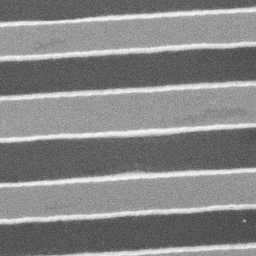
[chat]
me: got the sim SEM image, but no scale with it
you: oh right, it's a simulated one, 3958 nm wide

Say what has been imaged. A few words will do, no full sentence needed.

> lines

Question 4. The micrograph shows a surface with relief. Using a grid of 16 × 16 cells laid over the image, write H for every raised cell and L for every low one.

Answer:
LLLLLLLLLLLLLLLL
LLHHHHHHHHHHHHHH
HHHHHHHHHHHHHHHH
HHHLLLLLLLLLLLLL
LLLLLLLLLLLLLLLL
LLLLLLLLLLLLHHHH
HHHHHHHHHHHHHHHH
HHHHHHHHHHHHHHHH
HHHHLLLLLLLLLLLL
LLLLLLLLLLLLLLLL
LLLLLLLLLLLLLLLL
LLHHHHHHHHHHHHHH
HHHHHHHHHHHHHHHH
HHHHHLLLLLLLLLLL
LLLLLLLLLLLLLLLL
LLLLLLLLLLLLLLHH